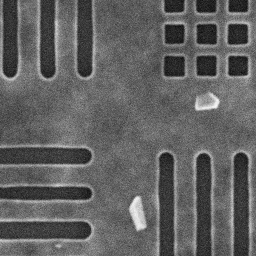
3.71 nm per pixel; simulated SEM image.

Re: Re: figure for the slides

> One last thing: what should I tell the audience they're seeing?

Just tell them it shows groups of lines, slits or small figures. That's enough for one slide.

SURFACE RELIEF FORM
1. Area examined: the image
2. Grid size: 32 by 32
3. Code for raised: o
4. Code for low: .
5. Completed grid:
..ooo..ooo..oooooooo...o...o...o
..ooo..ooo..ooooooooo..oo..oo..o
..ooo..ooo..oooooooooooooooooooo
..ooo..ooo..ooooooooo..oo..o...o
..ooo..ooo..ooooooooo..o...o...o
..ooo..ooo..ooooooooo.ooo..oo..o
..ooo..ooo..oooooooooooooooooooo
..ooo..ooo..ooooooooo..o...o...o
..ooo..ooo..oooooooo...o...o...o
o.ooo..ooo.oooooooooo..oo..oo..o
oooooooooooooooooooooooooooooooo
oooooooooooooooooooooooooooooooo
oooooooooooooooooooooooooooooooo
oooooooooooooooooooooooooooooooo
oooooooooooooooooooooooooooooooo
oooooooooooooooooooooooooooooooo
oooooooooooooooooooooooooooooooo
oooooooooooooooooooooooooooooooo
..........oooooooooooooooooooooo
...........ooooooooo..ooo.ooo..o
...........ooooooooo..oo..ooo..o
oooooooooooooooooooo..oo..ooo..o
oooooooooooooooooooo..oo..ooo..o
...........ooooooooo..oo..ooo..o
...........ooooooooo..oo..ooo..o
oooooooooooooooooooo..oo..ooo..o
oooooooooooooooooooo..oo..ooo..o
oooooooooooooooooooo..ooo.ooo..o
...........ooooooooo..oo..ooo..o
...........ooooooooo..oo..ooo..o
oooooooooooooooooooo..oo..ooo..o
oooooooooooooooooooo..oo..ooo..o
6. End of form